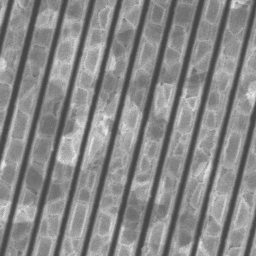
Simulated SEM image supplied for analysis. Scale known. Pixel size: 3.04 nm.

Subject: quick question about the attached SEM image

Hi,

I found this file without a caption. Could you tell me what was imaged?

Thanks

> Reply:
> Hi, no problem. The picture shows parallel lines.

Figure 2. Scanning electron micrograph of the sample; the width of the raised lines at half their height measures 59 nm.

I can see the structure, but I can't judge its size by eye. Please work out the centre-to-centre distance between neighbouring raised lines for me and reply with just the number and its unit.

26.4 pixels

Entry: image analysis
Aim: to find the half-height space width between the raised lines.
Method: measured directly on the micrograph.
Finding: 19.9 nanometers